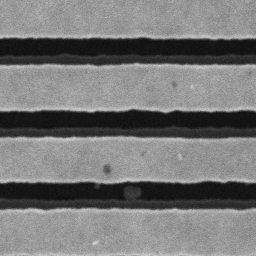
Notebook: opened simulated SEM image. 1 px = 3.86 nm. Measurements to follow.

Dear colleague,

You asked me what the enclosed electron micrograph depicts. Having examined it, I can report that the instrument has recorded lines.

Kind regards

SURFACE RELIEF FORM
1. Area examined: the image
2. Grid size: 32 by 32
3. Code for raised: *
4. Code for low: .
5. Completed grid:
********************************
********************************
********************************
********************************
********************************
................................
................................
................................
********************************
********************************
********************************
********************************
********************************
********************************
................................
................................
................................
********************************
********************************
********************************
********************************
********************************
********************************
................................
................................
................................
********************************
********************************
********************************
********************************
********************************
********************************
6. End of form